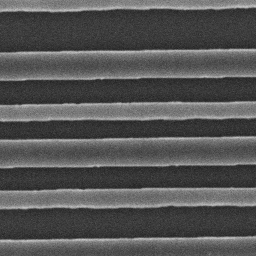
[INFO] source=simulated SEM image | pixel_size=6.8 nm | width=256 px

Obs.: lines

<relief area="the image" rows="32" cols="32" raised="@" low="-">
@@@@@@@@@@@@@@@@@@@@@@@@@@@@@@@@
--------------------------------
--------------------------------
--------------------------------
--------------------------------
--------------------------------
-----------@@@@@@@@@@@@@@@@@@@@@
@@@@@@@@@@@@@@@@@@@@@@@@@@@@@@@@
@@@@@@@@@@@@@@@@@@@@@@@@@@@@@@@@
@@@@@@@@@@@@@@@@@@@@@@@@@@@@@@@@
--------------------------------
--------------------------------
--------------------------------
@@@@@@@@@@@@@@@@@@@@@@@@@@@@@@@@
@@@@@@@@@@@@@@@@@@@@@@@@@@@@@@@@
--------------------------------
--------------------------------
-----@@@@@@@@@@@@@@@@@@@@@@@@@@@
@@@@@@@@@@@@@@@@@@@@@@@@@@@@@@@@
@@@@@@@@@@@@@@@@@@@@@@@@@@@@@@@@
@@@@@@@@@@@@@@@@@@@@@@@@@@@@@@--
--------------------------------
--------------------------------
--------------------------------
@@@@@@@@@@@@@@@@@@@@@@@@@@@@@@@@
@@@@@@@@@@@@@@@@@@@@@@@@@@@@@@@@
--------------------------------
--------------------------------
--------------------------------
--------------------------------
@@@@@@@@@@@@@@@@@@@@@@@@@@@@@@@@
@@@@@@@@@@@@@@@@@@@@@@@@@@@@@@@@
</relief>